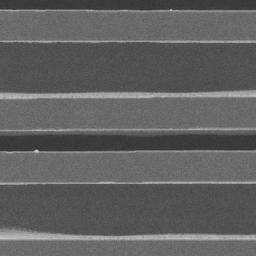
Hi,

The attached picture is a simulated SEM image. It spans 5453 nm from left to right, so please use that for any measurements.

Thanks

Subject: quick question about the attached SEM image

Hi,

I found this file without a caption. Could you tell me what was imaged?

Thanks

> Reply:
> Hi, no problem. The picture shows lines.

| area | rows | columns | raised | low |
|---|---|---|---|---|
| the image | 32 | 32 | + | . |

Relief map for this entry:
................................
++++++++++++++++++++++++++++++++
++++++++++++++++++++++++++++++++
++++++++++++++++++++++++++++++++
++++++++++++++++++++++++++++++++
................................
................................
................................
................................
................................
................................
................................
++++++++++++++++++++++++++++++++
++++++++++++++++++++++++++++++++
++++++++++++++++++++++++++++++++
++++++++++++++++++++++++++++++++
................................
................................
................................
++++++++++++++++++++++++++++++++
++++++++++++++++++++++++++++++++
++++++++++++++++++++++++++++++++
++++++++++++++++++++++++++++++++
................................
................................
................................
................................
................................
................................
................................
++++++++++++++++++++++++++++++++
++++++++++++++++++++++++++++++++